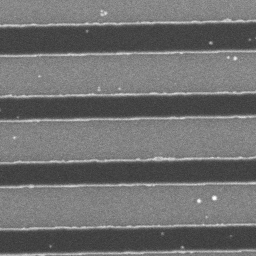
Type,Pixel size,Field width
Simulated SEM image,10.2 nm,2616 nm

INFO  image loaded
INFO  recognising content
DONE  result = lines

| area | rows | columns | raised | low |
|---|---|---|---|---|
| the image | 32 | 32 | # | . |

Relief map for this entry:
................................
................................
................................
################################
################################
################################
############################....
................................
................................
................................
................................
................................
################################
################################
################################
................................
................................
................................
................................
................................
################################
################################
################################
................................
................................
................................
................................
................................
......##########################
################################
################################
########################........